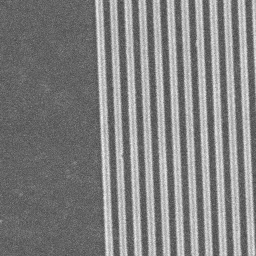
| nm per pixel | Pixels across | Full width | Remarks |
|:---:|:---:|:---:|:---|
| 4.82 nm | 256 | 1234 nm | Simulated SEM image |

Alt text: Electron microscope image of parallel lines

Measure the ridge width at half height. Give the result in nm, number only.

26.5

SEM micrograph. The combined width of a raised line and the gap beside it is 68.5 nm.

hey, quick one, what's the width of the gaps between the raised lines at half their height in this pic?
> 9.23 px